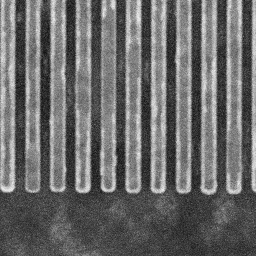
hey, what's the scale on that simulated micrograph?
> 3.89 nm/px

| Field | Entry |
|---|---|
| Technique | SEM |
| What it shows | parallel lines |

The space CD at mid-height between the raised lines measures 42.3 nm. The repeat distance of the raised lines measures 0.098 µm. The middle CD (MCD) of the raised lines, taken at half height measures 55.4 nanometres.